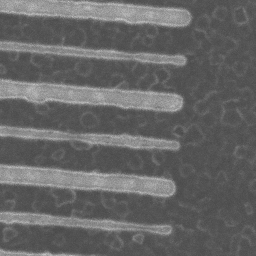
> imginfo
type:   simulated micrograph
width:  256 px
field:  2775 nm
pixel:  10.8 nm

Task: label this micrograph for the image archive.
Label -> parallel lines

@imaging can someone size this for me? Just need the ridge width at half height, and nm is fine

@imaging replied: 357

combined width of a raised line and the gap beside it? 458 nm